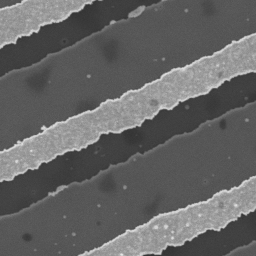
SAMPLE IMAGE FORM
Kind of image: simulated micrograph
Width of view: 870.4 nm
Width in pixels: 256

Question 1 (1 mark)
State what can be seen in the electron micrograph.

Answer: lines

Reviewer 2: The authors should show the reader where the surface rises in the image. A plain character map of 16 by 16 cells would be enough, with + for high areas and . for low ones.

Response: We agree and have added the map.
+++++....+++++++
+++....+++++++++
+....+++++++++++
...+++++++++++++
.+++++++++++++++
+++++++++++++...
+++++++++++.....
+++++++++....+++
++++++.....+++++
++++.....+++++++
++.....+++++++++
....++++++++++++
...+++++++++++++
+++++++++++++++.
+++++++++++++...
++++++++++.....+